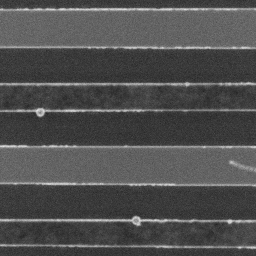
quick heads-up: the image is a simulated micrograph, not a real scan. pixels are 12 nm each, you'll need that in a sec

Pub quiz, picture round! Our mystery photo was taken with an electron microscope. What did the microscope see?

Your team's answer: lines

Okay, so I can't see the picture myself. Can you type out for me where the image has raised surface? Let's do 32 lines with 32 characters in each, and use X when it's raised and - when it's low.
--------------------------------
XXXXXXXXXXXXXXXXXXXXXXXXXXXXXXXX
XXXXXXXXXXXXXXXXXXXXXXXXXXXXXXXX
XXXXXXXXXXXXXXXXXXXXXXXXXXXXXXXX
XXXXXXXXXXXXXXXXXXXXXXXXXXXXXXXX
XXXXXXXXXXXXXXXXXXXXXXXXXXXXXXXX
--------------------------------
--------------------------------
--------------------------------
--------------------------------
XXXXXXXXXXXXXXXXXXXXXXXXXXXXXXXX
XXXXXXXXXXXXXXXXXXXXXXXXXXXXXXXX
XXXXXXXXXXXXXXXXXXXXXXXXXXXXXXXX
XXXXXXXXXXXXXXXXXXXXXXXXXXXXXXXX
--------------------------------
--------------------------------
--------------------------------
--------------------------------
XXXXXXXXXXXXXXXXXXXXXXXXXXXXXXXX
XXXXXXXXXXXXXXXXXXXXXXXXXXXXXXXX
XXXXXXXXXXXXXXXXXXXXXXXXXXXXXXXX
XXXXXXXXXXXXXXXXXXXXXXXXXXXXXXXX
XXXXXXXXXXXXXXXXXXXXXXXXXXXXXXXX
--------------------------------
--------------------------------
--------------------------------
--------------------------------
----------------XX--------------
XXXXXXXXXXXXXXXXXXXXXXXXXXXXXXXX
XXXXXXXXXXXXXXXXXXXXXXXXXXXXXXXX
XXXXXXXXXXXXXXXXXXXXXXXXXXXXXXXX
--------------------------------